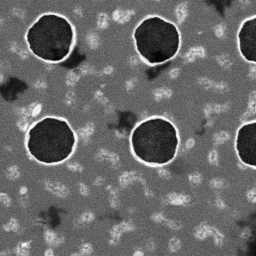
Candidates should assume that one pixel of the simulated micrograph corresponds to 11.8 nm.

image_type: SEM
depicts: holes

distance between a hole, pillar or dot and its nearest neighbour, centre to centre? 1210 nm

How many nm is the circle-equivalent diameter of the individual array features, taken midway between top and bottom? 543